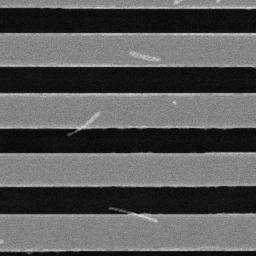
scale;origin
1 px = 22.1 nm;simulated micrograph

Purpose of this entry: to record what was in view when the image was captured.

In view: lines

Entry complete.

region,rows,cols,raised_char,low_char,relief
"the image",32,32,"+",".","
++++++++++++++++++++++++++++++++
................................
................................
................................
++++++++++++++++++++++++++++++++
++++++++++++++++++++++++++++++++
++++++++++++++++++++++++++++++++
++++++++++++++++++++++++++++++++
................................
................................
................................
................................
++++++++++++++++++++++++++++++++
++++++++++++++++++++++++++++++++
++++++++++++++++++++++++++++++++
++++++++++++++++++++++++++++++++
................................
................................
................................
++++++++++++++++++++++++++++++++
++++++++++++++++++++++++++++++++
++++++++++++++++++++++++++++++++
++++++++++++++++++++++++++++++++
................................
................................
................................
................................
++++++++++++++++++++++++++++++++
++++++++++++++++++++++++++++++++
++++++++++++++++++++++++++++++++
++++++++++++++++++++++++++++++++
................................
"